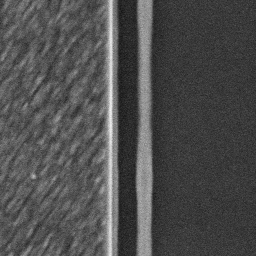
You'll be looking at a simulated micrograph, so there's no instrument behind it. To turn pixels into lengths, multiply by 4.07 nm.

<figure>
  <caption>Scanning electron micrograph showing wiring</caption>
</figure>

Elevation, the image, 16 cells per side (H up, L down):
HHHHHHHLLLLLLLLL
HHHHHHHLLLLLLLLL
HHHHHHHLLLLLLLLL
HHHHHHHLLLLLLLLL
HHHHHHHLLLLLLLLL
HHHHHHHLLLLLLLLL
HHHHHHHLLLLLLLLL
HHHHHHHLLLLLLLLL
HHHHHHHLLLLLLLLL
HHHHHHHLLLLLLLLL
HHHHHHHLLLLLLLLL
HHHHHHHLLLLLLLLL
HHHHHHHLLLLLLLLL
HHHHHHHLLLLLLLLL
HHHHHHHLLLLLLLLL
HHHHHHHLLLLLLLLL